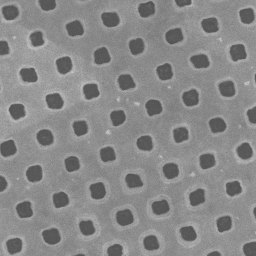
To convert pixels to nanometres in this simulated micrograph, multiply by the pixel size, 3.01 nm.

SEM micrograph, a regular array of holes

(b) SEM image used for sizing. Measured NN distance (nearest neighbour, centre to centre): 0.111 um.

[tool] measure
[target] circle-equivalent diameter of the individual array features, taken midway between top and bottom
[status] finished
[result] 52.5 nm